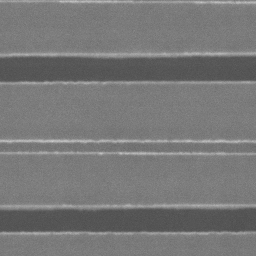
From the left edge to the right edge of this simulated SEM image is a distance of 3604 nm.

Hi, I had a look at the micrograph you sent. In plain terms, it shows lines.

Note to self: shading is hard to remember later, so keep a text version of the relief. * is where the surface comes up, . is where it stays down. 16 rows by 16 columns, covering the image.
****************
****************
****************
................
................
****************
****************
****************
****************
****************
****************
****************
****************
................
................
****************